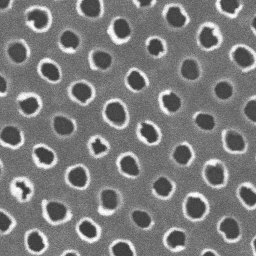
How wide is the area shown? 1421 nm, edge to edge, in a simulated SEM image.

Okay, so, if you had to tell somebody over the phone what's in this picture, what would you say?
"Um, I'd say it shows a regular array of holes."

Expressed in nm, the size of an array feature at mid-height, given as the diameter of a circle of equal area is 102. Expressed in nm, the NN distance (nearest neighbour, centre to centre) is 207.